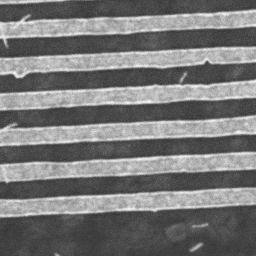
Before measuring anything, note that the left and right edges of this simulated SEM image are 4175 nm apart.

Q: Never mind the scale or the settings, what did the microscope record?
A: parallel lines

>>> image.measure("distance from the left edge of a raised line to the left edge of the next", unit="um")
0.578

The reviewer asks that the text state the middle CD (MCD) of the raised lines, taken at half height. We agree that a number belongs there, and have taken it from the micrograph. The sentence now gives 255 nm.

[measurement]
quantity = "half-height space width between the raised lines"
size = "334 nm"